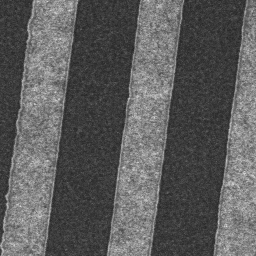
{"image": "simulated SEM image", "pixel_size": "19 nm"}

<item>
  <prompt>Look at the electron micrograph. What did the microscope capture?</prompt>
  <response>one or a few lines or trenches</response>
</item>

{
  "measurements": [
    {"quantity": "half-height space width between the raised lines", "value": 1190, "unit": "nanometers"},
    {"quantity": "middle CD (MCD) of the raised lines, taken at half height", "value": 822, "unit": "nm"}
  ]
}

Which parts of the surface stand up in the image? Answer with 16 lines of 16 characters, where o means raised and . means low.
..ooo....oo....o
..ooo....oo....o
..ooo...ooo....o
..oo....ooo....o
..oo....ooo....o
.ooo....ooo....o
.ooo....ooo....o
.ooo....oo....oo
.ooo....oo....oo
.ooo....oo....oo
.oo....ooo....oo
.oo....ooo....oo
ooo....ooo....oo
ooo....ooo....oo
ooo....ooo....oo
ooo....oo....ooo